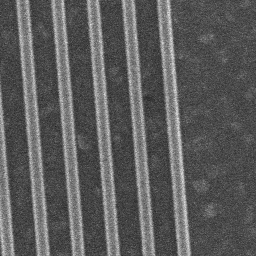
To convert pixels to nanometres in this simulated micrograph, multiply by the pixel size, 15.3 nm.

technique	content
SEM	parallel lines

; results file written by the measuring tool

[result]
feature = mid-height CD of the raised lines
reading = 157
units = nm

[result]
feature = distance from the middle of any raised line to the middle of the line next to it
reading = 538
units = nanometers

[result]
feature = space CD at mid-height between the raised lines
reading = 384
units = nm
